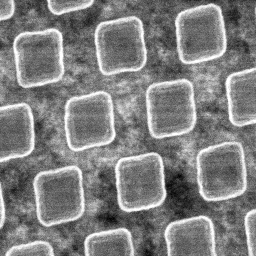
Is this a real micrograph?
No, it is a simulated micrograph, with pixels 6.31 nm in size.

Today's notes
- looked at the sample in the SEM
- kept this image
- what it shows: a regular array of raised bodies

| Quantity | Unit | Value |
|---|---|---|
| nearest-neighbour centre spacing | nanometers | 506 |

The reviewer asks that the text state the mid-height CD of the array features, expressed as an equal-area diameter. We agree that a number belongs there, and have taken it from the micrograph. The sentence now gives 332 nm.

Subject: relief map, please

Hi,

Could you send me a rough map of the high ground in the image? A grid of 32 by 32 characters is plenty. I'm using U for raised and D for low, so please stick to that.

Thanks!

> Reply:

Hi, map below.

UUDDDDUUUUUDDDDDDDDDDDDDDDDDDDDD
UDDDDDDUDDDDDDDDDDDDDDDDUUUDDDDD
DDDDDDDDDDDDDDDDUDDDDDUUUUUUDDDD
DDDDDDDDDDDDUUUUUUDDDDUUUUUUDDDD
DDDUUUUDDDDDUUUUUUDDDDUUUUUUDDDD
DDUUUUUUDDDDUUUUUUDDDDUUUUUUDDDD
DDUUUUUUDDDDUUUUUUDDDDDUUUUUDDDD
DDUUUUUUDDDDUUUUUUDDDDDUUDDDDDDD
DDUUUUUUDDDDDUUUUDDDDDDDDDDDDDDD
DDUUUUUDDDDDDDDDDDDDDDDDDDDDDUUU
DDDUUDDDDDDDDDDDDDDDDUUUDDDDUUUU
DDDDDDDDDDDDDDDDDDDUUUUUDDDDDUUU
DDDDDDDDDUUUUUDDDDDUUUUUDDDDDUUU
DUUDDDDDUUUUUUDDDDDUUUUUDDDDDUUU
UUUUDDDDUUUUUUDDDDDUUUUUDDDDDUUU
UUUUDDDDUUUUUUDDDDDUUUUUDDDDDDDD
UUUUDDDDUUUUUUDDDDDUUUUDDDDDDDDD
UUUUDDDDDUUUUUDDDDDDDDDDDDDDDDDD
UUUUDDDDDUDDDDDDDDDDDDDDDDDUUUDD
UUDDDDDDDDDDDDDDDDUUDDDDDUUUUUDD
DDDDDDDDDDDDDDDUUUUUDDDDDUUUUUDD
DDDDDDDUUUDDDDDUUUUUDDDDDUUUUUUD
DDDDDUUUUUDDDDDUUUUUDDDDDUUUUUUD
DDDDDUUUUUDDDDDUUUUUDDDDDUUUUUDD
DDDDDUUUUUDDDDDUUUUUDDDDDDUUUDDD
DDDDDUUUUUDDDDDUUUUUDDDDDDDDDDDD
DDDDDUUUUUDDDDDDDDDDDDDDDDDDDDDD
DDDDDUUUDDDDDDDDDDDDDDDDUUDDDDDU
DDDDDDDDDDDDDDDDDDDDDUUUUUDDDDDU
DDDDDDDDDDDDUUUUDDDDDUUUUUUDDDDU
DDDDUUDDDDDUUUUUDDDDDUUUUUUDDDDU
DUUUUUDDDDDUUUUUDDDDDUUUUUUDDDDU